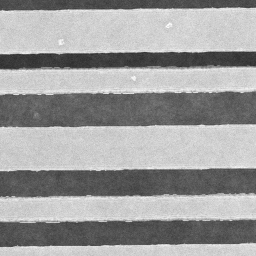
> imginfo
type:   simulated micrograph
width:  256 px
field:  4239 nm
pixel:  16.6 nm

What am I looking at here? lines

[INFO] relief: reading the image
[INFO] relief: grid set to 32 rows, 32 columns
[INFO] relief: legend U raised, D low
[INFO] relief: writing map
DDDDDDDDDDDDDDDDDDDDDDDDDDDDDDDD
UUUUUUUUUUUUUUUUUUUUUUUUUUUUUUUU
UUUUUUUUUUUUUUUUUUUUUUUUUUUUUUUU
UUUUUUUUUUUUUUUUUUUUUUUUUUUUUUUU
UUUUUUUUUUUUUUUUUUUUUUUUUUUUUUUU
UUUUUUUUUUUUUUUUUUUUUUUUUUUUUUUU
UUUUUUUUUUUUUUUUDDDDDDDDDDDDDDDD
DDDDDDDDDDDDDDDDDDDDDDDDDDDDDDDD
DDDDDDDDDDDDDDDDDDDDDDDDDDUUUUUU
UUUUUUUUUUUUUUUUUUUUUUUUUUUUUUUU
UUUUUUUUUUUUUUUUUUUUUUUUUUUUUUUU
UUUUUUUUUDDDDDDDDDDDDDDDDDDDDDDD
DDDDDDDDDDDDDDDDDDDDDDDDDDDDDDDD
DDDDDDDDDDDDDDDDDDDDDDDDDDDDDDDD
DDDDDDDDDDDDDDDDDDDDDDDDDDDDDDDD
DDDDDDDDDDDDDDDDDDDDDDDDDDDDDDDD
UUUUUUUUUUUUUUUUUUUUUUUUUUUUUUUU
UUUUUUUUUUUUUUUUUUUUUUUUUUUUUUUU
UUUUUUUUUUUUUUUUUUUUUUUUUUUUUUUU
UUUUUUUUUUUUUUUUUUUUUUUUUUUUUUUU
UUUUUUUUUUUUUUUUUUUUUUUUUUUUUUUU
DDDDDDDDDDDDDDDDDDDDDDDDDDDDDDDD
DDDDDDDDDDDDDDDDDDDDDDDDDDDDDDDD
DDDDDDDDDDDDDDDDDDDDDDDDDDDDDDDD
DDDDDDDDDDDDDDDDDDDDDDDDDDDUUUUU
UUUUUUUUUUUUUUUUUUUUUUUUUUUUUUUU
UUUUUUUUUUUUUUUUUUUUUUUUUUUUUUUU
UUUUUUUUUUUUDDDDDDDDDDDDDDDDDDDD
DDDDDDDDDDDDDDDDDDDDDDDDDDDDDDDD
DDDDDDDDDDDDDDDDDDDDDDDDDDDDDDDD
DDDDDDDDDDDDDDDDDDDDDDDDDDDDDDUU
UUUUUUUUUUUUUUUUUUUUUUUUUUUUUUUU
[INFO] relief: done